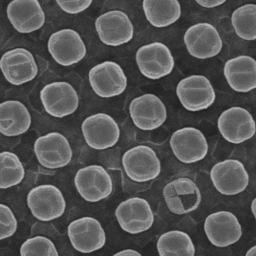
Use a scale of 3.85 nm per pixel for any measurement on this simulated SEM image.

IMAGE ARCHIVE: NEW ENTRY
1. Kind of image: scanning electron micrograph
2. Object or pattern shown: a regular array of raised bodies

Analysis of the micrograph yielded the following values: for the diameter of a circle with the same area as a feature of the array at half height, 138 nm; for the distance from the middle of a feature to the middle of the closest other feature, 198 nanometres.